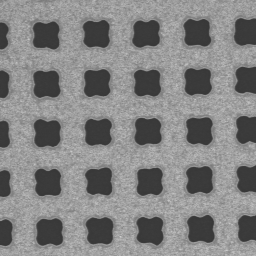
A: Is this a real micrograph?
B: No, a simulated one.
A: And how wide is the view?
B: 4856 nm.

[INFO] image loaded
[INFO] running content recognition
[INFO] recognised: a regular array of holes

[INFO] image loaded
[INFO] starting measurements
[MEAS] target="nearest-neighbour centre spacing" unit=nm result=927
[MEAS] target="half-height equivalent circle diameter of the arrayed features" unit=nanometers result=540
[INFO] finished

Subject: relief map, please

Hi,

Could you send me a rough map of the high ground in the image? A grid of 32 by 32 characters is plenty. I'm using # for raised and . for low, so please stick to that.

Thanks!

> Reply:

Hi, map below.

################################
################################
#########################.####..
.###...###....###...###...###...
.###...###....###...###...###...
.###...####...###...###...####..
################################
################################
##############################..
.###...####...###...###...###...
.###...####...###...###...###...
.###...####...###...###...####..
################################
################################
################################
.###...####...###...###....###..
.###...####...###...###...####..
.###...####...###...###...####..
################################
################################
################################
.####..####...###...###....###..
.###....###...###...###....###..
.###....###...###...###....###..
.###############################
################################
################################
.####..####...###...####...###..
..###...###...###...####...###..
.####...###...###...####...###..
.####..############.############
################################